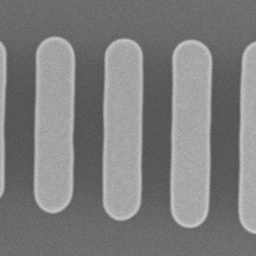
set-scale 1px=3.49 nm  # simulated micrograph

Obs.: groups of lines, slits or small figures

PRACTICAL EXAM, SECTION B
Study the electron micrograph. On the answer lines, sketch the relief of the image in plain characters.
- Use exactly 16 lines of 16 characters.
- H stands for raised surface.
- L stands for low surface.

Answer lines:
LLLLLLLLLLLLLLLL
LLLLLLLLLLLLLLLL
LLLHLLLLLLLLLLLL
LLHHHLLHHLLHHLLH
LLHHHLLHHLLHHLLH
LLHHHLLHHLLHHLLH
LLHHHLLHHLLHHLLH
LLHHHLLHHLLHHLLH
LLHHHLLHHLLHHLLH
LLHHHLLHHLLHHLLH
LLHHHLHHHLLHHLLH
LLHHHLHHHLLHHLLH
LLHHLLLHHLLHHLLH
LLLLLLLHLLLHHLLH
LLLLLLLLLLLLLLLL
LLLLLLLLLLLLLLLL